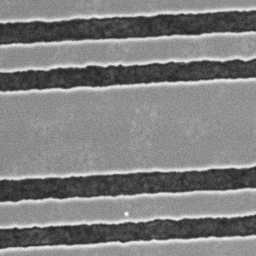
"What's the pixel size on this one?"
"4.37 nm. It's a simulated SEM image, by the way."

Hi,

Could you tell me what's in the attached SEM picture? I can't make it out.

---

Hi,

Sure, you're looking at lines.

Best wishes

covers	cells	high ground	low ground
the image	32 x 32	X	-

XXXXXXXXXXXXXXXXXXXXXXXXXXXXXXXX
XXXXXXXXXXXXXXXXXXXXXXXXXX------
XXXXXXXX------------------------
--------------------------------
--------------------XXXXXXXXXXXX
-XXXXXXXXXXXXXXXXXXXXXXXXXXXXXXX
XXXXXXXXXXXXXXXXXXXXXXXXXXXXXXXX
XXXXXXXXXXXXXXXXXXXXXXXXXXXXX-X-
XXXXXXX-------------------------
--------------------------------
-----------------XXXXXXXXXXXXXXX
XXXXXXXXXXXXXXXXXXXXXXXXXXXXXXXX
XXXXXXXXXXXXXXXXXXXXXXXXXXXXXXXX
XXXXXXXXXXXXXXXXXXXXXXXXXXXXXXXX
XXXXXXXXXXXXXXXXXXXXXXXXXXXXXXXX
XXXXXXXXXXXXXXXXXXXXXXXXXXXXXXXX
XXXXXXXXXXXXXXXXXXXXXXXXXXXXXXXX
XXXXXXXXXXXXXXXXXXXXXXXXXXXXXXXX
XXXXXXXXXXXXXXXXXXXXXXXXXXXXXXXX
XXXXXXXXXXXXXXXXXXXXXXXXXXXXXXXX
XXXXXXXXXXXXXXXXXXXXXXXXXXXXXXXX
XXXXXXXXXXXXXXXXXX--------------
--------------------------------
--------------------------------
---------------XXXXXXXXXXXXXXXXX
XXXXXXXXXXXXXXXXXXXXXXXXXXXXXXXX
XXXXXXXXXXXXXXXXXXXXXXXXXXXXXXXX
XXXXXXXXXXXXXXXXXXX-------------
XXX-----------------------------
-------------------------------X
------------XXXXXXXXXXXXXXXXXXXX
XXXXXXXXXXXXXXXXXXXXXXXXXXXXXXXX